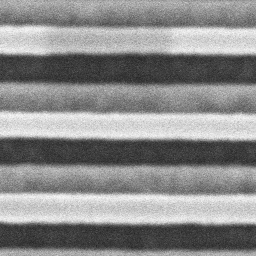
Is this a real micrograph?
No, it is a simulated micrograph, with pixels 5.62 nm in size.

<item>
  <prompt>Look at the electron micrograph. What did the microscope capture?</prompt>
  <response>lines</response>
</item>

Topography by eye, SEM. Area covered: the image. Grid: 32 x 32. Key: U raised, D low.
UUUUUUUUUUUUUUUUUUUUUUUUUUUUUUUU
UUUUUUUUUUUUUUUUUUUUUUUUUUUUUUUU
UUUUUUUUUUUUUUUUUUUUUUUUUUUUUUUU
UUUUUUUUUUUUUUUUUUUUUUUUUUUUUUUU
UUUUUUUUUUUUUUUUUUUUUUUUUUUUUUUU
UUUUUUUUUUUUUUUUUUUUUUUUUUUUUUUU
UUUUUUUUUUUUUUUUUUUUUUUUUUUUUUUU
DDDDDDDDDDDDDDDDDDDDDDDDDDDDDDDD
DDDDDDDDDDDDDDDDDDDDDDDDDDDDDDDD
DDDDDDDDDDDDDDDDDDDDDDDDDDDDDDDD
DDDDDDDDDDDDDDDDDDDDDDDDDDDDDDDD
UUUUUUUUUUUUUUUUUUUUUUUUUUUUUUUU
UUUUUUUUUUUUUUUUUUUUUUUUUUUUUUUU
UUUUUUUUUUUUUUUUUUUUUUUUUUUUUUUU
UUUUUUUUUUUUUUUUUUUUUUUUUUUUUUUU
UUUUUUUUUUUUUUUUUUUUUUUUUUUUUUUU
UUUUUUUUUUUUUUUUUUUUUUUUUUUUUUUU
DDDDDDDDDDDDDDDDDDDDDDDDDDDDDDDD
DDDDDDDDDDDDDDDDDDDDDDDDDDDDDDDD
DDDDDDDDDDDDDDDDDDDDDDDDDDDDDDDD
DDDDDDDDDDDDDDDDDDDDDDDDDDDDDDDD
UUUUUUUUUUUUUUUUUUUUUUUUUUUUUUUU
UUUUUUUUUUUUUUUUUUUUUUUUUUUUUUUU
UUUUUUUUUUUUUUUUUUUUUUUUUUUUUUUU
UUUUUUUUUUUUUUUUUUUUUUUUUUUUUUUU
UUUUUUUUUUUUUUUUUUUUUUUUUUUUUUUU
UUUUUUUUUUUUUUUUUUUUUUUUUUUUUUUU
UUUUUUUUUUUUUUUUUUUUUUUUUUUUUUUU
DDDDDDDDDDDDDDDDDDDDDDDDDDDDDDDD
DDDDDDDDDDDDDDDDDDDDDDDDDDDDDDDD
DDDDDDDDDDDDDDDDDDDDDDDDDDDDDDDD
UUUUUUUUUUUUUUUUDDDDDDDDDDDDDDDD